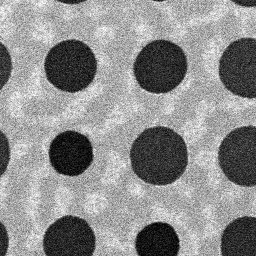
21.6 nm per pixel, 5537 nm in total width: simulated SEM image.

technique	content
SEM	holes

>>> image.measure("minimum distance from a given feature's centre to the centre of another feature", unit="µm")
1.89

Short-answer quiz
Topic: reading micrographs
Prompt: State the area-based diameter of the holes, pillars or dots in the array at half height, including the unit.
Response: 53.7 pixels